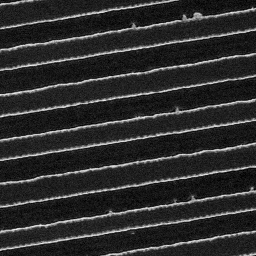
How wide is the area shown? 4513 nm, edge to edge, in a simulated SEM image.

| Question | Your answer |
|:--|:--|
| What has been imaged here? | lines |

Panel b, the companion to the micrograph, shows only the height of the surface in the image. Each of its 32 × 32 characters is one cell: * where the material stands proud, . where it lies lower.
*******************.............
*************................***
*******...............**********
*...............****************
...........*****************....
....*****************...........
***************.................
********...................*****
**...................***********
..............******************
........******************......
...*****************............
*************..................*
*******..................*******
*..................*************
.............****************...
......*****************.........
*****************...............
**********..................****
****..................**********
................****************
.........*******************....
....******************..........
***************.................
*********...................****
**....................**********
...............***************..
.........***************........
...**************...............
************................****
*****.................**********
................****************